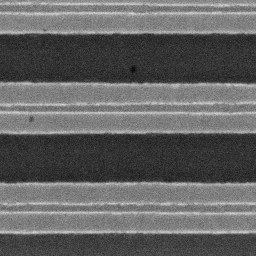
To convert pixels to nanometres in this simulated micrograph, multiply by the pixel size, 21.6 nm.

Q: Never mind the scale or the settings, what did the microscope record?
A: lines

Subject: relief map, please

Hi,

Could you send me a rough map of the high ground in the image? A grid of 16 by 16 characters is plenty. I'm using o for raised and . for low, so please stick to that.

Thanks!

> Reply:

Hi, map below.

oooooooooooooooo
oooooooooooooooo
................
................
................
oooooooooooooooo
oooooooooooooooo
oooooooooooooooo
................
................
................
.oooooooooo.....
oooooooooooooooo
oooooooooooooooo
.oo.............
................